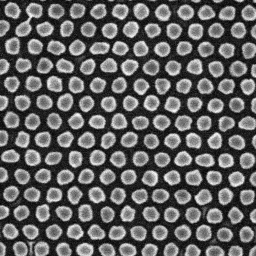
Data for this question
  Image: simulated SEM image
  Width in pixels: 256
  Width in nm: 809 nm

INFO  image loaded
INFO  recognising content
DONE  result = a regular array of raised bodies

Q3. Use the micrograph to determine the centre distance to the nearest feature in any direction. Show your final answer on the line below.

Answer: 20.6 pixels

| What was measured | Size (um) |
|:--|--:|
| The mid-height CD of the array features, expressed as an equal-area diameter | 0.0464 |